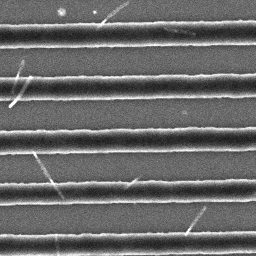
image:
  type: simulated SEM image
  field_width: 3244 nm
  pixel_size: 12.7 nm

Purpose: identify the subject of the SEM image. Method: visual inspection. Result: lines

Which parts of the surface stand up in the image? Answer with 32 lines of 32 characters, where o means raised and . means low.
................................
................................
................................
oooooooooooooooooooooooooooooooo
oooooooooooooooooooooooooooooooo
oooooooooooooooooooooooooooooooo
................................
................................
................................
....................oooooooooooo
oooooooooooooooooooooooooooooooo
oooooooooooooooooooooooooooooooo
oooo............................
................................
................................
................................
oooooooooooooooooooooooooooooooo
oooooooooooooooooooooooooooooooo
oooooooooooooooooooooooooooooooo
................................
................................
................................
............................ooo.
oooooooooooooooooooooooooooooooo
oooooooooooooooooooooooooooooooo
oo..............................
................................
................................
................................
oooooooooooooooooooooooooooooooo
oooooooooooooooooooooooooooooooo
oooooooooooooooooooooooooooooooo